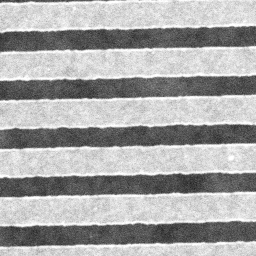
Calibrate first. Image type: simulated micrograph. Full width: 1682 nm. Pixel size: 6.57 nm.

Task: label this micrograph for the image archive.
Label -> lines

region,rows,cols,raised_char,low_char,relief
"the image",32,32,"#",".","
##.#############################
################################
################################
#################...............
................................
................................
.....###########################
################################
################################
########################........
................................
................................
.....#.#########################
################################
################################
######################.##.#....#
................................
................................
..........#...##################
################################
################################
##########################..###.
................................
................................
.............###################
################################
################################
################################
................................
................................
...................#.###########
################################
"